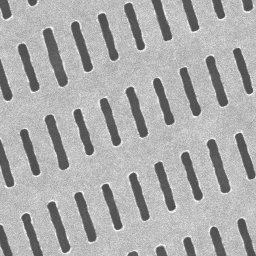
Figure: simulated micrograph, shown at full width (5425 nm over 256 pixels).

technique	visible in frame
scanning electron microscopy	a regular array of holes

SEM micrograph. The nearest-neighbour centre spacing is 28.4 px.